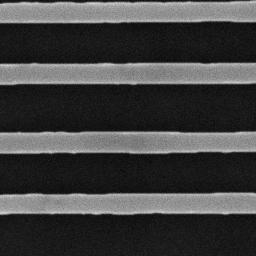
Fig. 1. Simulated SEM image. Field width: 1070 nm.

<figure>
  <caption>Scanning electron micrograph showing lines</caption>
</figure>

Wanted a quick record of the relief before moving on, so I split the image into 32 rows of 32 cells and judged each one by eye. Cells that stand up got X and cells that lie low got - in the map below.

XXXXXXXXXXXXXXXXXXXXXXXXXXXXXXXX
XXXXXXXXXXXXXXXXXXXXXXXXXXXXXXXX
XXXXXXXXXXXXXXXXXXXXXXXXXXXXXXXX
--------------------------------
--------------------------------
--------------------------------
--------------------------------
--------------------------------
XXXXXXXXXXXXXXXXXXXXXXXXXXXXXXXX
XXXXXXXXXXXXXXXXXXXXXXXXXXXXXXXX
XX--------------X---------------
--------------------------------
--------------------------------
--------------------------------
--------------------------------
--------------------------------
--------------------------------
XXXXXXXXXXXXXXXXXXXXXXXXXXXXXXXX
XXXXXXXXXXXXXXXXXXXXXXXXXXXXXXXX
--------------------------------
--------------------------------
--------------------------------
--------------------------------
--------------------------------
XXXXXXXXXXXXXXXXXXXXXXXXXXXXXXXX
XXXXXXXXXXXXXXXXXXXXXXXXXXXXXXXX
XXXXXXXXXXXXXXXXXXXXXXXXXXXXXXXX
--------------------------------
--------------------------------
--------------------------------
--------------------------------
--------------------------------